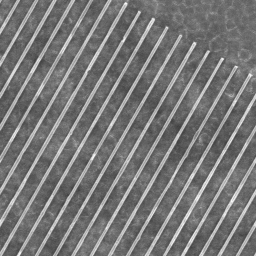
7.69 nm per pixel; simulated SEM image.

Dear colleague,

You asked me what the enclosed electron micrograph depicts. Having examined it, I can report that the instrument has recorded parallel lines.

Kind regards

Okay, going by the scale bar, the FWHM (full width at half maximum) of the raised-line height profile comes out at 20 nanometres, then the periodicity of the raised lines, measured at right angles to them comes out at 0.122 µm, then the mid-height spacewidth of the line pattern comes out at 102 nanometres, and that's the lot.